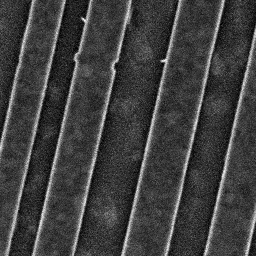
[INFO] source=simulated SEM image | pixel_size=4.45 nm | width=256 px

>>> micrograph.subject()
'one or a few lines or trenches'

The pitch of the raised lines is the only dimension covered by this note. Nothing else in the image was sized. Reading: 356 nm